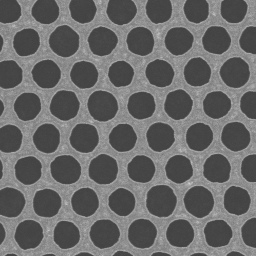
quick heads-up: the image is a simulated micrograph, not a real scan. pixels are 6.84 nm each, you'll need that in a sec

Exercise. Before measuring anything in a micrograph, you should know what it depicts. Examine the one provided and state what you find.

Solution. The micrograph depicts a regular array of holes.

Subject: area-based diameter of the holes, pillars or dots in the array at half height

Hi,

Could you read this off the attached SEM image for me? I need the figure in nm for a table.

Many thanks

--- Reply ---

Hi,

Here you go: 194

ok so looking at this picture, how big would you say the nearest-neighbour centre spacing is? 251 nanometres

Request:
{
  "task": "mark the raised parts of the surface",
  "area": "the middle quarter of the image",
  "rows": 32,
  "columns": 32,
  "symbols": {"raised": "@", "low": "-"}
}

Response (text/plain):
@@------@@@@-----@@@@------@@@--
@@------@@@------@@@-------@@@--
@--------@@------@@@--------@@--
@@------@@@------@@@@------@@@--
@@------@@@@-----@@@@------@@@@-
@@@-----@@@@@--@@@@@@@@---@@@@@@
@@@@@@@@@@@@@@@@@@@@@@@@@@@@-@@@
---@@@@-----@@@@@-----@@@@-----@
---@@@-------@@@------@@@@------
----@@-------@@@-------@@-------
----@@-------@@@-------@@-------
----@@-------@@@-------@@-------
---@@@-------@@@------@@@@-----@
--@@@@@-----@@@@@@---@@@@@@---@@
@@@@@@@@@-@@@@@@@@@@@@@@@@@@@@@@
@@@----@@@@@@----@@@@@----@@@@@@
@@------@@@@------@@@------@@@@-
@@-------@@-------@@@-------@@@-
@@-------@@-------@@@-------@@--
@@-------@@-------@@@------@@@@-
@@------@@@@------@@@------@@@@-
@@@----@@@@@@----@@@@@---@@@@@@@
@@@@@@@@@@@@@@@@@@@@@@@@@@@@@@@@
---@@@@@----@@@@@-----@@@@@----@
----@@@------@@@------@@@@------
----@@-------@@@-------@@-------
----@@--------@@-------@@-------
----@@-------@@@-------@@@------
----@@@------@@@@-----@@@@-----@
---@@@@@----@@@@@@---@@@@@@---@@
@@@@@@@@@@@@@@@@@@@@@@@---@@@@@@
@@@@---@@@@@@---@@@@@------@@@@-